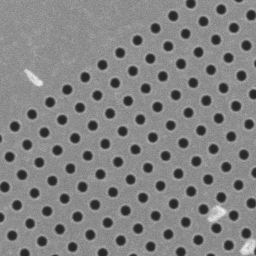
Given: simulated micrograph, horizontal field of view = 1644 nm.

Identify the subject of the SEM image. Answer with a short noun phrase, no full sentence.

a regular array of holes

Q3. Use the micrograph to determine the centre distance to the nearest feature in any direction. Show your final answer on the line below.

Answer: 136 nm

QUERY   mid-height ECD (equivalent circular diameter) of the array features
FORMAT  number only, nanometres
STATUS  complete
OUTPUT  63.5